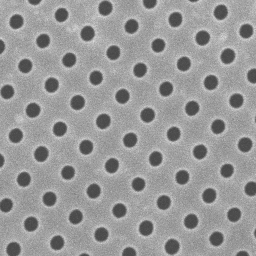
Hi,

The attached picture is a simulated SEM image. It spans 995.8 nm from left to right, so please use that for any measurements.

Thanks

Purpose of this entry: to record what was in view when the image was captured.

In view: a regular array of holes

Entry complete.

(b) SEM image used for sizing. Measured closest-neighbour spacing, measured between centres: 30.9 pixels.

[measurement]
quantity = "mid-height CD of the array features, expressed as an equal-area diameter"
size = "55.1 nm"